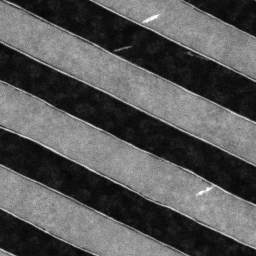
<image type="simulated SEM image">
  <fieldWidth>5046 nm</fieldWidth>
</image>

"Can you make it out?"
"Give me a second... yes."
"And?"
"one or a few lines or trenches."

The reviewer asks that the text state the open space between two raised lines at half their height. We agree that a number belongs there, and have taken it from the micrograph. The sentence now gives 38.4 px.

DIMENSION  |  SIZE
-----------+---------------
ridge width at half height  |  705 nm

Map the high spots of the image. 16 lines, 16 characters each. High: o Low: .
.oooooo.....oooo
...oooooo.....oo
.....oooooo.....
oo.....oooooo...
oooo.....oooooo.
.ooooo.....ooooo
...ooooo.....ooo
.....ooooo......
o......ooooo....
oooo.....ooooo..
oooooo.....ooooo
...ooooo.....ooo
.....oooo......o
o......ooooo....
ooo......ooooo..
ooooo......ooooo